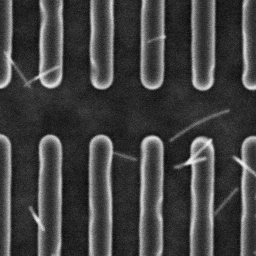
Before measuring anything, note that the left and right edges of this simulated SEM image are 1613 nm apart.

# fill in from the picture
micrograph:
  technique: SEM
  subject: groups of lines, slits or small figures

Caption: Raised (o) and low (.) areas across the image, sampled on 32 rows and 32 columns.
o....ooo...ooo....oo....ooo...oo
o....ooo...ooo....oo....ooo...oo
o....ooo...ooo....oo....ooo...oo
o....ooo....oo....oo....ooo...oo
o....ooo...ooo....ooo...ooo...oo
o....ooo...ooo....oo....ooo....o
o....ooo...ooo....oo....ooo....o
o....ooo...ooo....oo....ooo....o
o....ooo....oo....oo....ooo....o
o....ooo....oo....oo....ooo...oo
o....oo.....oo....oo....oo.....o
................................
................................
................................
................................
................................
................................
o....oo.....oo....oo.....o.....o
o....ooo...ooo....oo....ooo...oo
o....ooo...ooo....oo....ooo...oo
o....ooo...ooo....oo....ooo...oo
o....ooo...ooo....oo....ooo...oo
o....ooo...ooo....oo....ooo...oo
o....ooo...ooo....oo....ooo...oo
o....ooo...ooo....oo....ooo...oo
o....ooo...ooo....oo....ooo...oo
o....ooo...ooo....oo....oo....oo
o....ooo...ooo....oo....ooo...oo
o....ooo...ooo...ooo....ooo...oo
o....ooo...ooo....oo....ooo...oo
o....ooo...ooo....oo....ooo...oo
o....oo....ooo....oo....ooo...oo